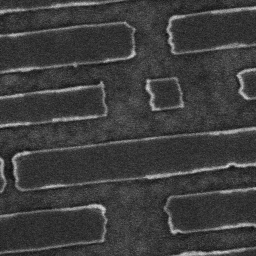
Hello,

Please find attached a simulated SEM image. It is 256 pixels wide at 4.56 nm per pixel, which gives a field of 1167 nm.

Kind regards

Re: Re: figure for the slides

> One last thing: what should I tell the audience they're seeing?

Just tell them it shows parallel lines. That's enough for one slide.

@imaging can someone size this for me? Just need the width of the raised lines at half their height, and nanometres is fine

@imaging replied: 175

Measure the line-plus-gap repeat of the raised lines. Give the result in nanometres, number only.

274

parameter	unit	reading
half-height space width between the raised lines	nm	98.6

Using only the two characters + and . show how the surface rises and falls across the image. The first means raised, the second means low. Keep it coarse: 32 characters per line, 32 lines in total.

++++++++++++....................
+.........................++++++
.....................+++++++++++
........+++++++++....+++++++++++
+++++++++++++++++....+++++++++++
+++++++++++++++++....+++++++++++
+++++++++++++++++.....++........
+++++++++++++++.................
++++++..........................
..............................++
..................++++........++
.....++++++++......++++.......++
+++++++++++++......++++.........
+++++++++++++......+++..........
+++++++++++++...................
+++++...........................
..........................++++++
................++++++++++++++++
........++++++++++++++++++++++++
..++++++++++++++++++++++++++++++
..++++++++++++++++++++++++++++++
..+++++++++++++++++++++++.......
+.+++++++++++++.................
..++++.........................+
......................++++++++++
.....................+++++++++++
....+++++++++........+++++++++++
+++++++++++++........+++++++++++
+++++++++++++........++++++++...
+++++++++++++...................
++++++++++......................
++.....................+++++++++